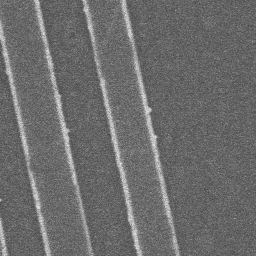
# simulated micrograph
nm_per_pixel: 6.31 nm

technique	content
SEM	one or a few lines or trenches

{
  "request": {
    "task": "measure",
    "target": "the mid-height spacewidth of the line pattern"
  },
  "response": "274 nm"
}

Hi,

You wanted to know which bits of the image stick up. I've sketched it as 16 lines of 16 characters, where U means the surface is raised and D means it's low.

UUDDDUUUDDDDDDDD
UUUDDUUUDDDDDDDD
UUUDDDUUDDDDDDDD
UUUDDDUUUDDDDDDD
UUUDDDUUUDDDDDDD
DUUUDDUUUDDDDDDD
DUUUDDDUUDDDDDDD
DUUUDDDUUDDDDDDD
DUUUDDDUUUDDDDDD
DDUUDDDUUUDDDDDD
DDUUUDDUUUDDDDDD
DDUUUDDDUUDDDDDD
DDUUUDDDUUDDDDDD
DDUUUDDDUUUDDDDD
DDDUUDDDUUUDDDDD
DDDUUUDDUUUDDDDD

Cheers